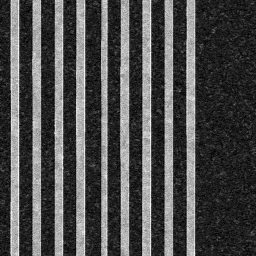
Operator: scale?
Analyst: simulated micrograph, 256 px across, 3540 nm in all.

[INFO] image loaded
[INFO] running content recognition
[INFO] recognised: parallel lines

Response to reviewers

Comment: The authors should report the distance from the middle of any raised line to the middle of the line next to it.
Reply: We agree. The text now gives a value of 304 nm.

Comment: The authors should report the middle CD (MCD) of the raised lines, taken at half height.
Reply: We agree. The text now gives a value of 111 nm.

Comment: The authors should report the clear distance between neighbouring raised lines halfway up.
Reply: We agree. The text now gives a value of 0.195 microns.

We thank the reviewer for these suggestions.